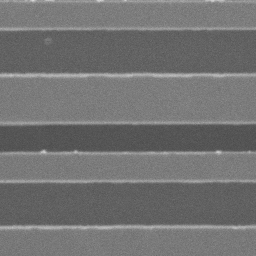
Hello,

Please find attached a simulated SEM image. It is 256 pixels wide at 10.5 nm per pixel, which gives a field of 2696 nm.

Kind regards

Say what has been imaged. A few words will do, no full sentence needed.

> lines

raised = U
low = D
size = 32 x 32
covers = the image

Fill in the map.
UUUUUUUUUUUUUUUUUUUUUUUUUUUUUUUU
UUUUUUUUUUUUUUUUUUUUUUUUUUUUUUUU
UUUUUUUUUUUUUUUUUUUUUUUUUUUUUUUU
UUUUUUUUUUUUUUUUUUUUUUUUUUUUUUUU
DDDDDDDDDDDDDDDDDDDDDDDDDDDDDDDD
DDDDDDDDDDDDDDDDDDDDDDDDDDDDDDDD
DDDDDDDDDDDDDDDDDDDDDDDDDDDDDDDD
DDDDDDDDDDDDDDDDDDDDDDDDDDDDDDDD
DDDDDDDDDDDDDDDDDDDDDDDDDDDDDDDD
UUUUUUUUUUUUUUUUUUUUUUUUUUUUUUUU
UUUUUUUUUUUUUUUUUUUUUUUUUUUUUUUU
UUUUUUUUUUUUUUUUUUUUUUUUUUUUUUUU
UUUUUUUUUUUUUUUUUUUUUUUUUUUUUUUU
UUUUUUUUUUUUUUUUUUUUUUUUUUUUUUUU
UUUUUUUUUUUUUUUUUUUUUUUUUUUUUUUU
DDDDDDDDDDDDDDDDDDDDDDDDDDDDDDDD
DDDDDDDDDDDDDDDDDDDDDDDDDDDDDDDD
DDDDDDDDDDDDDDDDDDDDDDDDDDDDDDDD
DDDDDDDDDDDDDDDDDDDDDDDDDDDDDDDD
UUUUUUUUUUUUUUUUUUUUUUUUUUUUUUUU
UUUUUUUUUUUUUUUUUUUUUUUUUUUUUUUU
UUUUUUUUUUUUUUUUUUUUUUUUUUUUUUUU
UUUUUUUUUUUUUUUUUUUUUUUUUUUUUUUU
DDDDDDDDDDDDDDDDDDDDDDDDDDDDDDDD
DDDDDDDDDDDDDDDDDDDDDDDDDDDDDDDD
DDDDDDDDDDDDDDDDDDDDDDDDDDDDDDDD
DDDDDDDDDDDDDDDDDDDDDDDDDDDDDDDD
DDDDDDDDDDDDDDDDDDDDDDDDDDDDDDDD
UUUUUUUUUUUUUUUUUUUUUUUUUUUUUUUU
UUUUUUUUUUUUUUUUUUUUUUUUUUUUUUUU
UUUUUUUUUUUUUUUUUUUUUUUUUUUUUUUU
UUUUUUUUUUUUUUUUUUUUUUUUUUUUUUUU